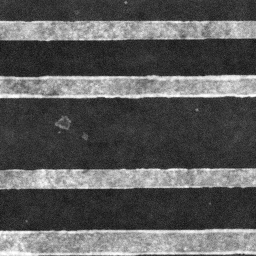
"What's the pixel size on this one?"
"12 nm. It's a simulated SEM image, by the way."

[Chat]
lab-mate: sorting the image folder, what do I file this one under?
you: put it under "lines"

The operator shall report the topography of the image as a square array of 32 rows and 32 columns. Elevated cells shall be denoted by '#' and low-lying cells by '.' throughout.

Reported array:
................................
................................
................................
################################
################################
................................
................................
................................
................................
................................
################################
################################
................................
................................
................................
................................
................................
................................
................................
................................
................................
################################
################################
#.#.............................
................................
................................
................................
................................
................................
################################
################################
################################